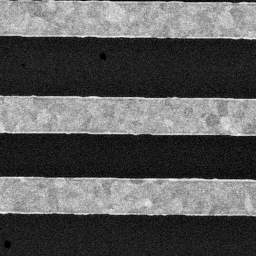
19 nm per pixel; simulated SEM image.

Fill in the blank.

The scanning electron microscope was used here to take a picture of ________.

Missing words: lines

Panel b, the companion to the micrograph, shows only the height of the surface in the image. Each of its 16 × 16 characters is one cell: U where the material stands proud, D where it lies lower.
UUUUUUUUUUUUUUUU
UUUUUUUUUUUUUUUU
DDDDDDDDDDDDDDDD
DDDDDDDDDDDDDDDD
DDDDDDDDDDDDDDDD
DDDDDDDDDDDDDDDD
UUUUUUUUUUUUUUUU
UUUUUUUUUUUUUUUU
DDDDDDDDDDDDDDDD
DDDDDDDDDDDDDDDD
DDDDDDDDDDDDDDDD
UUUUUUUUUUUUUUUU
UUUUUUUUUUUUUUUU
DDDDDDDDDDDDDDDD
DDDDDDDDDDDDDDDD
DDDDDDDDDDDDDDDD